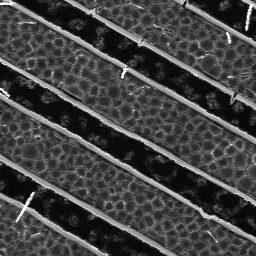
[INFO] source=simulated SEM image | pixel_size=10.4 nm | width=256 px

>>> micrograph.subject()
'one or a few lines or trenches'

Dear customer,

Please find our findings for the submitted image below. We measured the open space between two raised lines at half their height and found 573 nanometers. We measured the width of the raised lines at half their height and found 0.324 micrometres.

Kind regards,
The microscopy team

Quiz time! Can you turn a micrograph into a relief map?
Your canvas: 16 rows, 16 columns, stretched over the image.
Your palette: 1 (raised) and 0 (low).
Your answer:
0111100000001111
0001111000000011
0000011110000001
0000001111000000
1000000011110000
1110000000111100
0111100000001111
0001111000000011
0000111100000001
0000001111000000
1000000011110000
1110000000111100
1111100000011111
0011111000000111
0000111100000001
0000001111000000